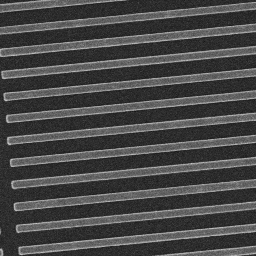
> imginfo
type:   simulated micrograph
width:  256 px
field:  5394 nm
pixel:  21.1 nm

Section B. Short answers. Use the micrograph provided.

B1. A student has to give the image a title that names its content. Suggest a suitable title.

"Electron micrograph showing parallel lines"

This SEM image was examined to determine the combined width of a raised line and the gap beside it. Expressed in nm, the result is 465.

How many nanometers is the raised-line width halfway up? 160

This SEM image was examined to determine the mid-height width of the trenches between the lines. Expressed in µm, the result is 0.296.